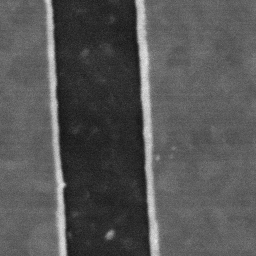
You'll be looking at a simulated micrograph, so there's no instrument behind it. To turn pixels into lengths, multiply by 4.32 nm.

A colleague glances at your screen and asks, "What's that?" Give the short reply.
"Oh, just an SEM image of one or a few lines or trenches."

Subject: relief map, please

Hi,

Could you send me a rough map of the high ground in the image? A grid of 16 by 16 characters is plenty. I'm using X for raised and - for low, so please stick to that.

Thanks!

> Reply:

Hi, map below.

XXX------XXXXXXX
XXX------XXXXXXX
XXX------XXXXXXX
XXX------XXXXXXX
XXX------XXXXXXX
XXX------XXXXXXX
XXX------XXXXXXX
XXX------XXXXXXX
XXXX-----XXXXXXX
XXXX-----XXXXXXX
XXXX-----XXXXXXX
XXXX-----XXXXXXX
XXXX-----XXXXXXX
XXXX-----XXXXXXX
XXXX-----XXXXXXX
XXXX------XXXXXX